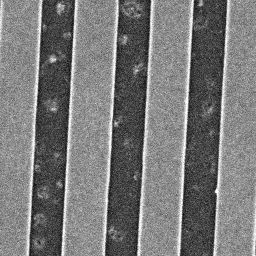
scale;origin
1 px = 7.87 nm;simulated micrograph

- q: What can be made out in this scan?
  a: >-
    one or a few lines or trenches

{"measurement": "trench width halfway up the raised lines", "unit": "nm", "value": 270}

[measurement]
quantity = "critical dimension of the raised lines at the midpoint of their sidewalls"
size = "324 nm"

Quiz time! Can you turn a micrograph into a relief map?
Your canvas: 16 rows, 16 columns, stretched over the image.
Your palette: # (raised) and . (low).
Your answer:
###..##..###..##
###..##..###..##
##...##..###..##
##...##..###..##
##...##..###..##
##..###..###..##
##..###..###..##
##..###..###..##
##..###..###..##
##..###..###..##
##..###..##...##
##..###..##...##
##..###..##...##
##..###..##...##
##..###..##..###
##..###..##..###